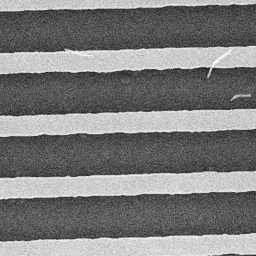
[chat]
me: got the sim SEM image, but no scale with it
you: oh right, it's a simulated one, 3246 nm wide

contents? lines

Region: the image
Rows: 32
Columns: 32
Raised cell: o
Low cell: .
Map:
oooooooooooooooooooooooooooooooo
................................
................................
................................
................................
................................
.......ooooooooooooooooooooooooo
oooooooooooooooooooooooooooooooo
oooooooooooooooooooooooo........
................................
................................
................................
................................
................................
....oooooooooooooooooooooooooooo
oooooooooooooooooooooooooooooooo
oooooooooooooooooo..............
................................
................................
................................
................................
................................
oooooooooooooooooooooooooooooooo
oooooooooooooooooooooooooooooooo
oooooooo.o......................
................................
................................
................................
................................
.........................ooooooo
oooooooooooooooooooooooooooooooo
oooooooooooooooooooooooooooooooo